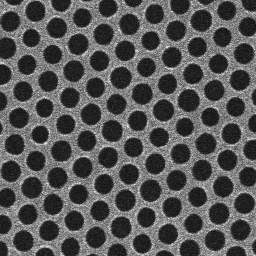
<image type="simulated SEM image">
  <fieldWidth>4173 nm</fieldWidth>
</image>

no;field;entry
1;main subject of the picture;a regular array of holes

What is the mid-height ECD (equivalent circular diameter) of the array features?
340 nm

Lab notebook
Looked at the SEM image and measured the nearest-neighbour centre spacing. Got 438 nm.